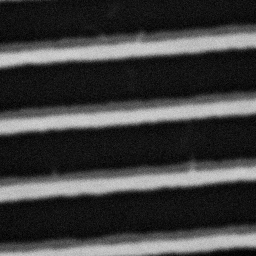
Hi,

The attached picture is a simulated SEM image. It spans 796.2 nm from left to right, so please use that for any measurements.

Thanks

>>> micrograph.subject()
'lines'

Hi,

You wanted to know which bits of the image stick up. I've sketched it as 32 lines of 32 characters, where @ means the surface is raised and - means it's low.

--------------------------------
--------------------------------
--------------------------------
----------------------------@@@@
--------------@@@@@@@@@@@@@@@@@@
----@@@@@@@@@@@@@@@@@@@@@@@@@@@@
@@@@@@@@@@@@@@@@@@@@@@@@@-------
@@@@@@@@------------------------
--------------------------------
--------------------------------
--------------------------------
--------------------------------
----------------------@@@@@@@@@@
---------@@@@@@@@@@@@@@@@@@@@@@@
@@@@@@@@@@@@@@@@@@@@@@@@@@------
@@@@@@@@@@@@@@@-----------------
@@@-----------------------------
--------------------------------
--------------------------------
--------------------------------
-----------------------@@@@@@@@@
------------@@@@@@@@@@@@@@@@@@@@
@@@@@@@@@@@@@@@@@@@@@@@@@@@@@@--
@@@@@@@@@@@@@@@@@@@-------------
@@@@@@--------------------------
--------------------------------
--------------------------------
--------------------------------
-----------------------------@@@
---------------@@@@@@@@@@@@@@@@@
----@@@@@@@@@@@@@@@@@@@@@@@@@@@@
@@@@@@@@@@@@@@@@@@@@@@@@--------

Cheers